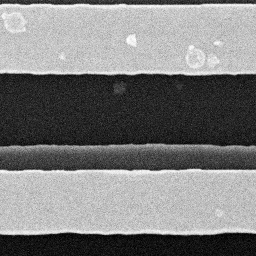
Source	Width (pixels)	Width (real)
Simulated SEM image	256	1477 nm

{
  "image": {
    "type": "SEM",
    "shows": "lines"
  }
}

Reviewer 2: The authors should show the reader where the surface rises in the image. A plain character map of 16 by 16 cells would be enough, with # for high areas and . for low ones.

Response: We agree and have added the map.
################
################
################
################
################
................
................
................
................
################
################
################
################
################
################
................